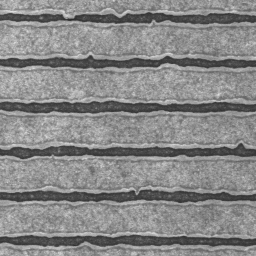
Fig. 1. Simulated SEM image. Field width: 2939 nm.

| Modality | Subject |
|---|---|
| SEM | parallel lines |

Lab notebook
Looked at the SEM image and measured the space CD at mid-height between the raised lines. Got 132 nanometres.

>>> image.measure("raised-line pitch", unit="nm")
512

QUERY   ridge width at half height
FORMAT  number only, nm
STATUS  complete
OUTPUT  377